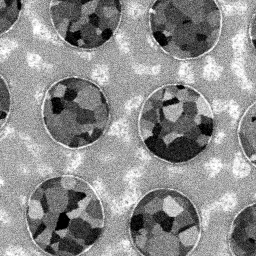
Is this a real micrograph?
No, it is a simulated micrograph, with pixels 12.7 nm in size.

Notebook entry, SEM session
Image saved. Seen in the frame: raised bodies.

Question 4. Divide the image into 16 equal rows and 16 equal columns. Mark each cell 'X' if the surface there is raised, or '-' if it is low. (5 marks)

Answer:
X--XXXXX-XXXXX--
X--XXXX--XXXXX--
----XXX---XXXX--
-----------X----
----------------
X--XXX----XX----
X--XXXX--XXXX---
---XXXX--XXXX--X
---XXX---XXXX--X
---------XXXX--X
----------------
---XX-----------
--XXXX---XXX----
--XXXX--XXXX---X
--XXXX--XXXX--XX
---XXX---XXX--XX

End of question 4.